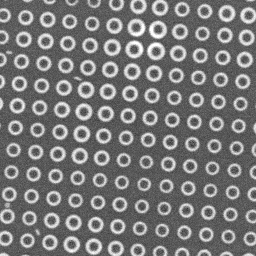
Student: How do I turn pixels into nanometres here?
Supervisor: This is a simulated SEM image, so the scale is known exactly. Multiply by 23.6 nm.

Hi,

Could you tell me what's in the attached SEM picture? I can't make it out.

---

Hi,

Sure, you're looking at an array of small figures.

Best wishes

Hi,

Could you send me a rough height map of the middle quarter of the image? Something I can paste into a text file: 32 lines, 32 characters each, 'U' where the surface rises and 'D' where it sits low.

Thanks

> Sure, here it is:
UUDDUUUUDDUUUDDDUUDDDDDDDDDDDDDD
UUDDUUUUDDUUUDDUUUUDDUUUDDDUUDDD
DDDDDUUDDDUUUDDUUUUDDUUUDDUUUUDD
DDDDDDDDDDDDDDDDUUDDDUUUDDDUUUDD
UDDDDDDDDDDDDDDDDDDDDDDDDDDDUDDD
UUDDUUUDDDUUDDDDDDDDDDDDDDDDDDDD
UUDDUUUDDUUUUDDUUUDDDUUDDDDDDDDD
UDDDUUUDDUUUUDDUUUDDUUUUDDUUUDDD
DDDDDDDDDDUUDDDUUUDDUUUUDDUUUDDD
DDDDDDDDDDDDDDDDDDDDDUUDDDUUUDDD
UDDDUUDDDDDDDDDDDDDDDDDDDDDDDDDD
UDDUUUUDDUUUDDDUUDDDDDDDDDDDDDDD
UDDUUUUDDUUUDDUUUUDDUUUDDDUUDDDD
DDDDUUDDDUUUDDUUUUDDUUUDDUUUUDDU
DDDDDDDDDDDDDDDUUDDDUUUDDUUUUDDU
DDDDDDDDDDDDDDDDDDDDDDDDDDUUDDDU
UDDUUUDDDUUDDDDDDDDDDDDDDDDDDDDD
UDDUUUDDUUUUDDUUUDDDUUDDDDDDDDDD
DDDUUUDDUUUUDDUUUDDDUUUDDUUUDDDD
DDDDDDDDDUUDDDUUUDDUUUUDDUUUDDDU
DDDDDDDDDDDDDDDDDDDDDUDDDUUUDDDU
DDDUUDDDDDDDDDDDDDDDDDDDDDDDDDDD
DDUUUUDDUUUDDDDDDDDDDDDDDDDDDDDD
DDUUUUDDUUUDDUUUDDDDUUDDDUUDDDDD
DDDUUDDDUUUDDUUUDDDUUUDDDUUUDDUU
DDDDDDDDDDDDDDUDDDDDUUDDUUUUDDUU
DDDDDDDDDDDDDDDDDDDDDDDDDUUDDDUU
DDUUUDDDUDDDDDDDDDDDDDDDDDDDDDDD
DDUUUDDUUUDDDUUDDDDDDDDDDDDDDDDD
DDUUUDDDUUDDDUUUDDDUUDDDUUUDDDDD
DDDDDDDDUUDDDUUUDDDUUDDDUUUDDDUU
DDDDDDDDDDDDDDDDDDDDDDDDUUUDDDUU